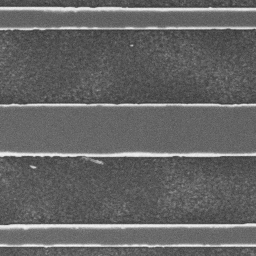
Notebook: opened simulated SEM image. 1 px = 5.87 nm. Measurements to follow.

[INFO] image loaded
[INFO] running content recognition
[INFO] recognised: lines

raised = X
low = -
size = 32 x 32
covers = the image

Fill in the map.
--------------------------------
XXXXXXXXXXXXXXXXXXXXXXXXXXXXXXXX
XXXXXXXXXXXXXXXXXXXXXXXXXXXXXXXX
XXXXXXXXXXXXXXXXXXXXXXXXX-XX-XXX
--------------------------------
--------------------------------
--------------------------------
--------------------------------
--------------------------------
--------------------------------
--------------------------------
--------------------------------
--------------------------------
XXXXXXXXXXXXXXXXXXXXXXXXXXXXXXXX
XXXXXXXXXXXXXXXXXXXXXXXXXXXXXXXX
XXXXXXXXXXXXXXXXXXXXXXXXXXXXXXXX
XXXXXXXXXXXXXXXXXXXXXXXXXXXXXXXX
XXXXXXXXXXXXXXXXXXXXXXXXXXXXXXXX
XXXXXXXXXXXXXXXXXXXXXXXXXXXXXXXX
------------XXX----------X------
--------------------------------
--------------------------------
--------------------------------
--------------------------------
--------------------------------
--------------------------------
--------------------------------
--------------------------------
XXXXXXXXXXXXXXXXXXXXXXXXXXXXXXXX
XXXXXXXXXXXXXXXXXXXXXXXXXXXXXXXX
XXXXXXXXXXXXXXXXXXXXXXXXXXXXXXXX
--------------------------------